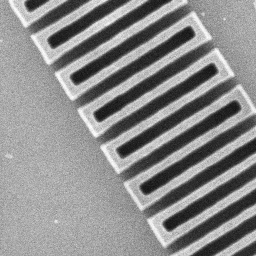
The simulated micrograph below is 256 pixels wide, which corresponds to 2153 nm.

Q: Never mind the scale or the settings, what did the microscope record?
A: groups of lines, slits or small figures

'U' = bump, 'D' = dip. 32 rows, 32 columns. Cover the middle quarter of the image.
DUUUUDDDDDDUUUUUDDDDDUUUUUDDDDDU
UUUUDDDDDUUUUUDDDDDUUUUUDDDDDDUU
UUDDDDDDUUUUDDDDDDUUUUUDDDDDUUUU
UUDDDDUUUUUDDDDDUUUUUDDDDDUUUUUD
UUDDDUUUUDDDDDDUUUUDDDDDDUUUUUDD
UUUUUUUDDDDDDUUUUUDDDDDUUUUUDDDD
DUUUUUDDDDDDUUUUDDDDDDUUUUDDDDDD
DUUUDDDDDDUUUUUDDDDDUUUUUDDDDDUU
DDUDDDDDUUUUUDDDDDDUUUUDDDDDDUUU
DDDDDDDUUUUDDDDDDUUUUUDDDDDUUUUU
DDDDDUUUUUDDDDDUUUUUDDDDDDUUUUDD
DDDDUUUUDDDDDDUUUUDDDDDDUUUUUDDD
DDDDUUUDDDDDUUUUUDDDDDDUUUUDDDDD
DDDDDUUUDDDUUUUDDDDDDUUUUDDDDDDU
DDDDDDUUUUUUUUDDDDDUUUUUDDDDDUUU
DDDDDDUUUUUUDDDDDDUUUUDDDDDDUUUU
DDDDDDDUUUUDDDDDUUUUUDDDDDUUUUUD
DDDDDDDDUDDDDDUUUUUDDDDDUUUUUDDD
DDDDDDDDDDDDDUUUUUDDDDDUUUUUDDDD
DDDDDDDDDDDUUUUUDDDDDUUUUUDDDDDD
DDDDDDDDDDUUUUDDDDDDUUUUDDDDDDUU
DDDDDDDDDDUUUDDDDDUUUUUDDDDDUUUU
DDDDDDDDDDDUUUDDDUUUUUDDDDDUUUUD
DDDDDDDDDDDUUUUUUUUUDDDDDUUUUUDD
DDDDDDDDDDDDUUUUUUDDDDDDUUUUUDDD
DDDDDDDDDDDDDUUUDDDDDDUUUUUDDDDD
DDDDDDDDDDDDDUUDDDDDDUUUUDDDDDDU
DDDDDDDDDDDDDDDDDDDUUUUDDDDDDUUU
DDDDDDDDDDDDDDDDDDUUUUDDDDDDUUUU
DDDDDDDDDDDDDDDDUUUUDDDDDDUUUUUD
DDDDDDDDDDDDDDDDUUUDDDDDUUUUUDDD
DDDDDDDDDDDDDDDDUUUDDDDUUUUDDDDD